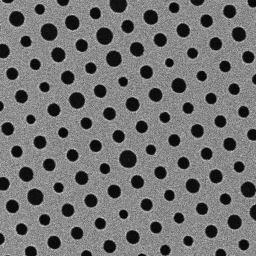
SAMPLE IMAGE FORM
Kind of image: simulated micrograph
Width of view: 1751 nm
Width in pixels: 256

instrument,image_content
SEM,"a regular array of holes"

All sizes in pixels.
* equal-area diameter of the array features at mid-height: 12.5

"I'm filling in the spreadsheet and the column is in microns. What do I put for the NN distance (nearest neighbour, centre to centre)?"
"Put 0.168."